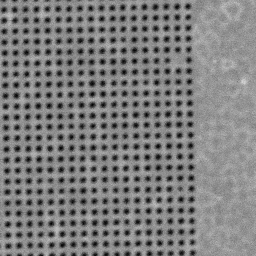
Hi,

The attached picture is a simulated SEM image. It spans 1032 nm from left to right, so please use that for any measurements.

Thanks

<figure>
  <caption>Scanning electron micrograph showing a regular array of holes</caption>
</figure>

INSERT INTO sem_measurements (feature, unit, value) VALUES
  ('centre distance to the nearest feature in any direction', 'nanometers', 42.3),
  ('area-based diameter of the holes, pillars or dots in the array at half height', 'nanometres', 22.7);